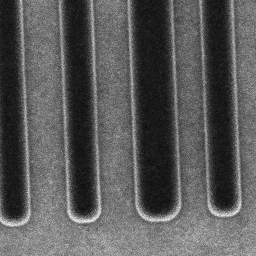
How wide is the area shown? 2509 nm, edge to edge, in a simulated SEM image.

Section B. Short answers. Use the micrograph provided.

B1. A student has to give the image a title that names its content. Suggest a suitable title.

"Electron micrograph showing one or a few lines or trenches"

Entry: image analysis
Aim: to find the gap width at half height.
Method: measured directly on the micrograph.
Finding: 356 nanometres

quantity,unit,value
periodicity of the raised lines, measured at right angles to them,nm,689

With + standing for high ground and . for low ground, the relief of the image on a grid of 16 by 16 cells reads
+...++..+++..++.
+...++..+++..++.
+...++..+++..++.
+...++..+++..++.
+...++..+++..++.
++..++..+++..++.
++..++..+++..++.
++..++..+++..++.
++..++..+++..++.
++..++..+++..++.
++..++..+++..++.
++..++..+++..++.
++..++...++..++.
++..++...++.....
................
................